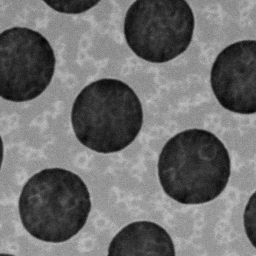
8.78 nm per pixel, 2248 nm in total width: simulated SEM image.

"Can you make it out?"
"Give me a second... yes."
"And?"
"holes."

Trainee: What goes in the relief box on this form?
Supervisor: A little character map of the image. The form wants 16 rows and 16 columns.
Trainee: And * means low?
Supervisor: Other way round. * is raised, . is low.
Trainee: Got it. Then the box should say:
***...**....****
********....****
...*****....****
...******..***..
...**********...
...**...*****...
*****....*****..
****.....*******
*****....**...**
******.***....**
***.******....**
**...*****....**
*.....*****..***
*.....*********.
**...**...*****.
*******....*****